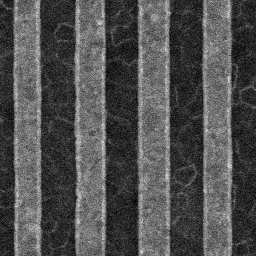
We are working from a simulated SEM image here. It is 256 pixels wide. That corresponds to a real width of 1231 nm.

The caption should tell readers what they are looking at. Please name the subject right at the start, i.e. one or a few lines or trenches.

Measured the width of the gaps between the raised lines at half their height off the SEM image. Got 175 nanometres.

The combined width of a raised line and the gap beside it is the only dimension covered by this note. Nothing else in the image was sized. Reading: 304 nanometers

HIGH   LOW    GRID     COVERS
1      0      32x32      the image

00111000001110000011100000111000
00111000001110000011100000111000
00111000001110000111100000111000
00111000001110000111100000111000
00111000001110000111100000111000
00111000001110000111100000111000
00111000001110000111100000111000
00111000001110000011100000111000
00111000001110000111100000111000
00111000001110000111100000111000
00111000001110000111100000111000
00111000001110000111100000111000
00111000001110000111100000111000
00111000001110000111100000111000
00111000001110000111100000111000
00111000001110000111100000111000
00111000001110000111100000111000
00111000001110000111100000111000
00111000001110000111100000111000
00111000001110000011100000111000
00111000001110000011100000111000
00111000001110000011100000111000
00111000001110000011100000111000
00111000001110000111100000111000
00111000001110000011100000111000
00111000001110000011100000111000
00111000001110000111100000111000
00111000001110000011100000111000
00111000001110000111100000111000
00111000001110000111100000111000
00111000001110000111100000111000
00111000001110000111100000111000